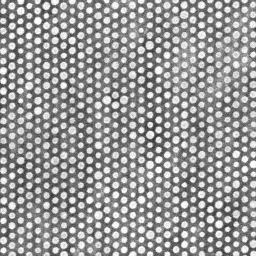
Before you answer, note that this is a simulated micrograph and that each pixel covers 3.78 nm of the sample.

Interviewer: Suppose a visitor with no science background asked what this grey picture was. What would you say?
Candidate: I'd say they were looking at a regular array of raised bodies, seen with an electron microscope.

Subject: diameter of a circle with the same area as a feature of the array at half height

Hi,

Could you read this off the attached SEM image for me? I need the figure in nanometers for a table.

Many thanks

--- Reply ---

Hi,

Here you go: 22.2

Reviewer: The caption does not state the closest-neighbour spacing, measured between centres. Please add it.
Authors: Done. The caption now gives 0.0367 µm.